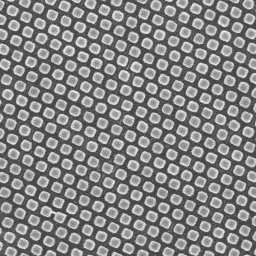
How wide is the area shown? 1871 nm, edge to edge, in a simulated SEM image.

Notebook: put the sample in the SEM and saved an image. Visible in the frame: a regular array of raised bodies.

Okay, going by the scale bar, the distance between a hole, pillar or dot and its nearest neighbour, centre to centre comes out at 0.108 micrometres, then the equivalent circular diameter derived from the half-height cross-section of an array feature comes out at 74.2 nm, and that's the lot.